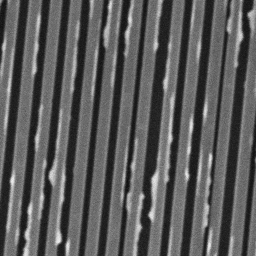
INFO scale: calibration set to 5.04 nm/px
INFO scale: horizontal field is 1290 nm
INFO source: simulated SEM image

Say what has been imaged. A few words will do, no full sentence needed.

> parallel lines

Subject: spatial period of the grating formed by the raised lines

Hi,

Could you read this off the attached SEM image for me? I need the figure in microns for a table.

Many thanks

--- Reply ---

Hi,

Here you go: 0.102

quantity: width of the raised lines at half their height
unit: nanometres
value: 60.7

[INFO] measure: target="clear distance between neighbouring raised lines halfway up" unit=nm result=41.9